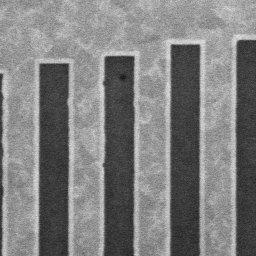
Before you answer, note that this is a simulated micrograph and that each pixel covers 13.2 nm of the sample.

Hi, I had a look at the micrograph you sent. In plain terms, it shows one or a few lines or trenches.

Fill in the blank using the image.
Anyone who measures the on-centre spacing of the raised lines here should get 0.867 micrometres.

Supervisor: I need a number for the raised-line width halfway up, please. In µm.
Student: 0.424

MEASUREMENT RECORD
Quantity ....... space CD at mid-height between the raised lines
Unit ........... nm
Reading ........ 447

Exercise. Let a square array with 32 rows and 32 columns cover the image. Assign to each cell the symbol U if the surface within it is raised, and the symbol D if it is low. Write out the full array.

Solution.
UUUUUUUUUUUUUUUUUUUUUUUUUUUUUUUU
UUUUUUUUUUUUUUUUUUUUUUUUUUUUUUUU
UUUUUUUUUUUUUUUUUUUUUUUUUUUUUUUU
UUUUUUUUUUUUUUUUUUUUUUUUUUUUUUUU
UUUUUUUUUUUUUUUUUUUUUUUUUUUUUUUU
UUUUUUUUUUUUUUUUUUUUUDDDDUUUUDDD
UUUUUUUUUUUUUUUUUUUUUDDDDUUUUDDD
UUUUUUUUUUUUUDDDDUUUUDDDDUUUUDDD
UUUUUDDDDUUUUDDDDUUUUDDDDUUUUDDD
DUUUUDDDDUUUUDDDDUUUUDDDDUUUUDDD
DUUUUDDDDUUUUDDDDUUUUDDDDUUUUDDD
DUUUUDDDDUUUUDDDDUUUUDDDDUUUUDDD
DUUUUDDDDUUUUDDDDUUUUDDDDUUUUDDD
DUUUUDDDDUUUUDDDDUUUUDDDDUUUUDDD
DUUUDDDDDUUUUDDDDUUUUDDDDUUUUDDD
DUUUUDDDDUUUUDDDDUUUUDDDDUUUUDDD
DUUUUDDDDUUUUDDDDUUUUDDDDUUUUDDD
DUUUDDDDDUUUUDDDDUUUUDDDDUUUUDDD
DUUUDDDDDUUUUDDDDUUUUDDDDUUUUDDD
DUUUUDDDDUUUUDDDDUUUUDDDDUUUUDDD
DUUUUDDDDUUUUDDDDUUUUDDDDUUUUDDD
DUUUUDDDDUUUUDDDDUUUUDDDDUUUUDDD
DUUUUDDDDUUUUDDDDUUUUDDDDUUUUDDD
DUUUDDDDDUUUUDDDDUUUUDDDDUUUUDDD
DUUUDDDDDUUUUDDDDUUUUDDDDUUUUDDD
DUUUUDDDDUUUUDDDDUUUUDDDDUUUUDDD
DUUUUDDDDUUUUDDDDUUUUDDDDUUUUDDD
DUUUUDDDDUUUUDDDDUUUUDDDDUUUUDDD
DUUUUDDDDUUUUDDDDUUUUDDDDUUUUDDD
DUUUUDDDDUUUUDDDDUUUUDDDDUUUUDDD
DUUUUDDDDUUUUDDDDUUUUDDDDUUUUDDD
DUUUDDDDDUUUUDDDDUUUUDDDDUUUUDDD